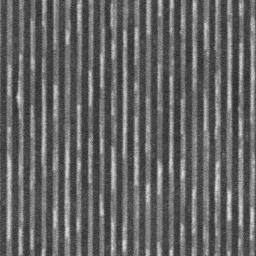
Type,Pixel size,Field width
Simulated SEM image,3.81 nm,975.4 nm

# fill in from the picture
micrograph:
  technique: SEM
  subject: parallel lines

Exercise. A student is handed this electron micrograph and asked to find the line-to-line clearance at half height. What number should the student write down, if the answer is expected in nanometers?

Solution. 26.7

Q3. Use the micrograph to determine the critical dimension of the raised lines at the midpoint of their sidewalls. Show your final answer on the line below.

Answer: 0.0167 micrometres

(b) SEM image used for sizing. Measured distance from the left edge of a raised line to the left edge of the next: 44 nm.